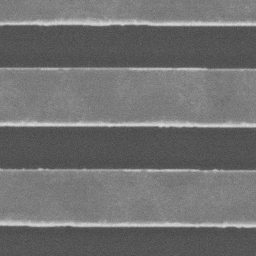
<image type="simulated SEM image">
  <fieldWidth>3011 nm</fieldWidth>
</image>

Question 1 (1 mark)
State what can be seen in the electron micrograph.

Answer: lines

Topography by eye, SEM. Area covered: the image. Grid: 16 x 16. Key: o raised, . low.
oooooooooooooooo
oooooooooooooooo
................
................
oooooooooooooooo
oooooooooooooooo
oooooooooooooooo
oooooooooooooooo
................
................
................
oooooooooooooooo
oooooooooooooooo
oooooooooooooooo
................
................